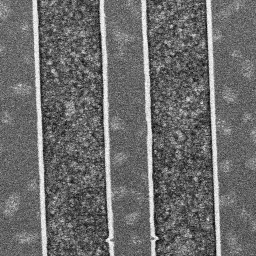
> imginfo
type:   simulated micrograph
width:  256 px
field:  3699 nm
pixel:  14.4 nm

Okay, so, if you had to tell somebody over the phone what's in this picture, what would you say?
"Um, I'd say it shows one or a few lines or trenches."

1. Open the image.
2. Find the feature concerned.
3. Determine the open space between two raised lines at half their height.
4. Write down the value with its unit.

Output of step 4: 950 nanometres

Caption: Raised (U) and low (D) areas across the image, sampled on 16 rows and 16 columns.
UUDDDDUUUDDDDUUU
UUDDDDUUUDDDDUUU
UUDDDDUUUDDDDUUU
UUDDDDDUUDDDDUUU
UUDDDDDUUDDDDUUU
UUDDDDDUUDDDDUUU
UUDDDDDUUDDDDUUU
UUDDDDDUUDDDDUUU
UUUDDDDUUDDDDUUU
UUUDDDDUUDDDDUUU
UUUDDDDUUDDDDUUU
UUUDDDDUUDDDDDUU
UUUDDDDUUDDDDDUU
UUUDDDDUUDDDDDUU
UUUDDDDUUUDDDDUU
UUUDDDDUUUDDDDUU